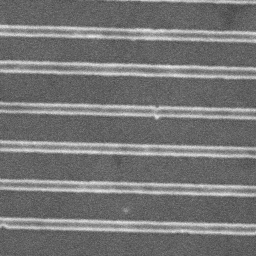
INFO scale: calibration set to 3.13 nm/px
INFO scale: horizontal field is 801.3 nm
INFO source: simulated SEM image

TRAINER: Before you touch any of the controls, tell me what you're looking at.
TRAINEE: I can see parallel lines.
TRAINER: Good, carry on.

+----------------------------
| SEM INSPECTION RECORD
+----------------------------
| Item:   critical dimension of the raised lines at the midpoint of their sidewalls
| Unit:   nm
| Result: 29.3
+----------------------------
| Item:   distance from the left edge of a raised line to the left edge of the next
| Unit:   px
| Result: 38.5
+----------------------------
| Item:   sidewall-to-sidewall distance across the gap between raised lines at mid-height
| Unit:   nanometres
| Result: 89.9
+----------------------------